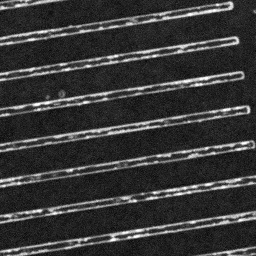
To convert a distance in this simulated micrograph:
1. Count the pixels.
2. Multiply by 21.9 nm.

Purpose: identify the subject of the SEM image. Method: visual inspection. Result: parallel lines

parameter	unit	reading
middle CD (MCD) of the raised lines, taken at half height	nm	149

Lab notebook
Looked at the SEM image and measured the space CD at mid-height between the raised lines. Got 618 nanometres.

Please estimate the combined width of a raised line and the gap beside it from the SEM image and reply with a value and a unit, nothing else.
771 nanometres